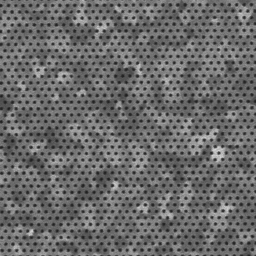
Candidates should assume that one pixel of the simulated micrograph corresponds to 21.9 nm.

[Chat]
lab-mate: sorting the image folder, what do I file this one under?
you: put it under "a regular array of holes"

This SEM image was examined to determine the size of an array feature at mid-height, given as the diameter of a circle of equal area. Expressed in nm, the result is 89.3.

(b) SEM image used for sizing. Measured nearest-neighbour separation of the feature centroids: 0.152 µm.